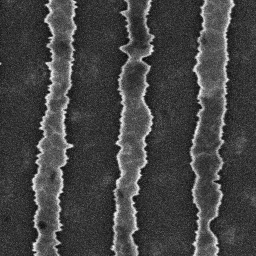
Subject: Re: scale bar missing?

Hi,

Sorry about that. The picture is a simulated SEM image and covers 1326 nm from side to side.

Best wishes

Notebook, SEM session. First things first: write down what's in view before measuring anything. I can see one or a few lines or trenches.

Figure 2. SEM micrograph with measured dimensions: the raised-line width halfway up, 124 nm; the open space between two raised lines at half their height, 286 nm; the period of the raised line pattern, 403 nm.